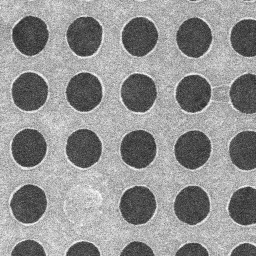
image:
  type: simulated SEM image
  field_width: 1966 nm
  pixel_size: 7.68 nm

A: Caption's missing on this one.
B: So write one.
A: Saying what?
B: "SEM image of a regular array of holes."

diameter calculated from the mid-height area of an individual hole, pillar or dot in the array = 297 nanometers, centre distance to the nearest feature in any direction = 419 nanometers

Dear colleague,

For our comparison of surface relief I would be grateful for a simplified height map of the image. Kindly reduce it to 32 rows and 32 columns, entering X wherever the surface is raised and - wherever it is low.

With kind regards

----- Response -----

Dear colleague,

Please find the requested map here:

XXXXXXXXXXXXXXXXXXXXXXXXXXXXXXXX
XXXXXXXXXXXXXXXXXXXXXXXXXXXXXXXX
XXX--XXXX---XXXX---XXXX--XXXXX--
XX----XX-----XX-----XX----XXX---
XX----XX-----XX-----XX-----XX---
XX----XX-----XX-----XX----XXX---
XXX--XXXX---XXXX---XXXX---XXX---
XXXXXXXXXXXXXXXXXXXXXXXXXXXXXXXX
XXXXXXXXXXXXXXXXXXXXXXXXXXXXXXXX
XX---XXXX---XXXX---XXXX--XXXXX--
XX----XXX----XX----XXX----XXX---
X-----XX-----XX-----XX----------
XX----XX-----XX----XXX----------
XX---XXXX---XXXX---XXXX---XXX---
XXXXXXXXXXXXXXXXXXXXXXXXXXXXXXXX
XXXXXXXXXXXXXXXXXXXXXXXXXXXXXXXX
XX---XXXX---XXXX---XXXX--XXXXX--
XX----XX-----XX----XXX----XXX---
X-----XX-----XX-----XX-----XX---
XX----XX-----XX-----XX----XXX---
XX---XXXX---XXXX---XXX----XXX---
XXXXXXXXXXXXXXXXXXXXXXXXXXXXXXXX
XXXXXXXXXXXXXXXXXXXXXXXXXXXXXXXX
XX---XXXXXXXXXXX--XXXXX--XXXXX--
X-----XXXXXXXXX----XXX----XXX---
X-----XXXXXXXXX-----XX----XXX---
X-----XXXXXXXXX----XXX----XXX---
XX---XXXXXXXXXXX---XXX----XXX---
XXXXXXXXXXXXXXXXXXXXXXXXXXXXXXXX
XXXXXXXXXXXXXXXXXXXXXXXXXXXXXXXX
XX---XXXX---XXXX--XXXXX--XXXXX--
X-----XX----XXX----XXX----XXX---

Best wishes